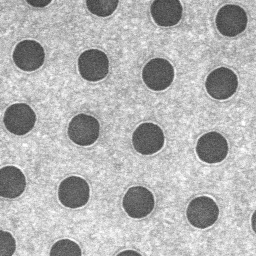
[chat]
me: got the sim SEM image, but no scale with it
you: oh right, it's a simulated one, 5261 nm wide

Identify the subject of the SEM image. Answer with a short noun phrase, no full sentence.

a regular array of holes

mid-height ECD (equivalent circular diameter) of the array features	681	nm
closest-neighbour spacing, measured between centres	1320	nanometers